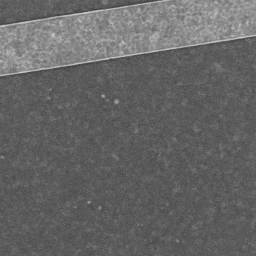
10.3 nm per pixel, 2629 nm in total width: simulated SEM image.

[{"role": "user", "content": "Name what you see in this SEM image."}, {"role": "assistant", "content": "one or a few lines or trenches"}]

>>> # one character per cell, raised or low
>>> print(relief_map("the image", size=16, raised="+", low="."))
.......+++++++++
.+++++++++++++++
++++++++++++++..
++++++++........
+...............
................
................
................
................
................
................
................
................
................
................
................